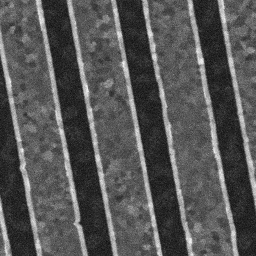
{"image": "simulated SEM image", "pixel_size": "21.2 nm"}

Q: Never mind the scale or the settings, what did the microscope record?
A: one or a few lines or trenches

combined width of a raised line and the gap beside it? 1580 nanometres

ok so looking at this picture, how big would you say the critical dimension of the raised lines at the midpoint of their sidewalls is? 938 nm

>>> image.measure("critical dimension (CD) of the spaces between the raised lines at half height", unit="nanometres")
632